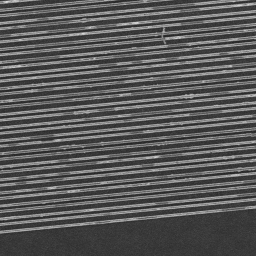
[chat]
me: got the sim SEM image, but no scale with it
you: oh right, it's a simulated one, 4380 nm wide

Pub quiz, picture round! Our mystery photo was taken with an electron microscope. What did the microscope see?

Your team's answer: parallel lines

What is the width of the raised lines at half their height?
36.2 nanometers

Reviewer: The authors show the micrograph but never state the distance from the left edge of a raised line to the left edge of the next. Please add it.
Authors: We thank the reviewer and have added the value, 111 nm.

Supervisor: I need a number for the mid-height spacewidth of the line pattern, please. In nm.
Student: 80.8